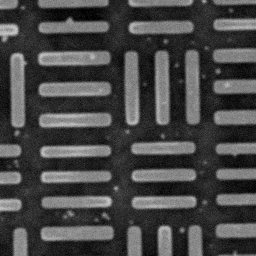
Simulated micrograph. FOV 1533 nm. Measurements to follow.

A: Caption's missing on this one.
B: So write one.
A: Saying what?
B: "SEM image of groups of lines, slits or small figures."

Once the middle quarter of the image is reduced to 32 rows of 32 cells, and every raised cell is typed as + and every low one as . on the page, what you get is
...............+++.....+++.....+
...............+++.....+++.....+
...............+++.....+++.....+
...............++++....+++.....+
...............++++....+++.....+
++++++++++++...+++.....+++.....+
++++++++++++...+++.....+++.....+
+++++...+++....+++.....+++.....+
................++.....+++.....+
................++.....+++.....+
................++......++.....+
................++......++.....+
................++.....+++.....+
++++++++++++....++.....+++.....+
++++++++++++....++......++.....+
................................
................................
................................
................................
................................
.................+++++++++++++++
+++++++++++......+++++++++++++++
+++++++++++.....................
................................
................................
................................
..........................++++++
++++++++++++.....+++++++++++++++
++++++++++++.....+++++++++++++++
................................
................................
................................